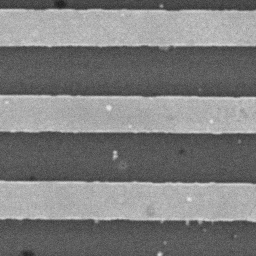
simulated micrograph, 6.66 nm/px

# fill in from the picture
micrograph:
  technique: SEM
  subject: lines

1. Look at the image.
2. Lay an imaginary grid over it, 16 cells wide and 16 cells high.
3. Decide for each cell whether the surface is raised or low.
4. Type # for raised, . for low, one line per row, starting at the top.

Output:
................
################
################
................
................
................
################
################
................
................
................
################
################
################
................
................